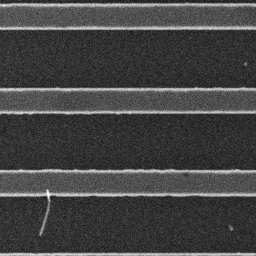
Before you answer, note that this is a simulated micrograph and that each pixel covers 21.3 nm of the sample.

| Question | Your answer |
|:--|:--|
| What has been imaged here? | lines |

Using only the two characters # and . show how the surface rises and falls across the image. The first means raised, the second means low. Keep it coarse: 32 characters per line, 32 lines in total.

################################
################################
################################
################################
................................
................................
................................
................................
................................
................................
................................
################################
################################
################################
................................
................................
................................
................................
................................
................................
................................
################################
################################
################################
................................
................................
................................
................................
................................
................................
................................
................................